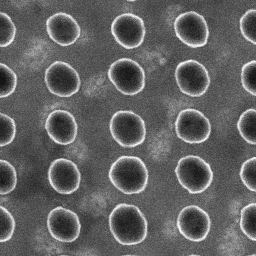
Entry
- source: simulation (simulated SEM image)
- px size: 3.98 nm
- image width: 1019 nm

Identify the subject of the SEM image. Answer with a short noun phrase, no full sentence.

a regular array of raised bodies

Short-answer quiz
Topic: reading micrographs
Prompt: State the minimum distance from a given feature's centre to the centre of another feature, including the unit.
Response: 47.7 px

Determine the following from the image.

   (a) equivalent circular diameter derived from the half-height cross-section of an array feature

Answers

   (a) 135 nanometers